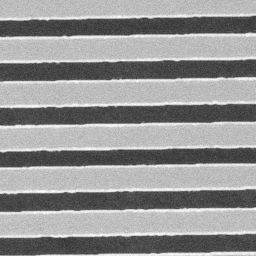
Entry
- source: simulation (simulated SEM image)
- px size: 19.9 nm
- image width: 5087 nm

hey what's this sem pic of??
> lines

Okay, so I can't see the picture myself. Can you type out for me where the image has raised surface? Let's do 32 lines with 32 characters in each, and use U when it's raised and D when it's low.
UUUUUUUUUUUUUUUUUUUUUUUUUUUUUUUU
UUUUUUUUUUUUUUUUUUUUUUUUUUUUUUUU
DDDDDDDDDDDDDDDDDDDDDDDDDDDDDDDD
DDDDDDDDDDDDDDDDDDDDDDDDDDDDDDDD
DDDDDDDDDDDDDDDDUUUUUUUUUUUUUUUU
UUUUUUUUUUUUUUUUUUUUUUUUUUUUUUUU
UUUUUUUUUUUUUUUUUUUUUUUUUUUUUUUU
UUUUUUUUUUUUUUUUUUUUDUUDDDDDDDDD
DDDDDDDDDDDDDDDDDDDDDDDDDDDDDDDD
DDDDDDDDDDDDDDDDDDDDDDDDDDDDDDDD
UUUUUUUUUUUUUUUUUUUUUUUUUUUUUUUU
UUUUUUUUUUUUUUUUUUUUUUUUUUUUUUUU
UUUUUUUUUUUUUUUUUUUUUUUUUUUUUUUU
DDDDDDDDDDDDDDDDDDDDDDDDDDDDDDDD
DDDDDDDDDDDDDDDDDDDDDDDDDDDDDDDD
DDDDDDDDDDDDDDDDDDUUUUUUUUUUUUUU
UUUUUUUUUUUUUUUUUUUUUUUUUUUUUUUU
UUUUUUUUUUUUUUUUUUUUUUUUUUUUUUUU
UUUUUUUUUUUUUUUUUUUUUDDDDDDDDDDD
DDDDDDDDDDDDDDDDDDDDDDDDDDDDDDDD
DDDDDDDDDDDDDDDDDDDDDDDDDDDDDDDD
UUUUUUUUUUUUUUUUUUUUUUUUUUUUUUUU
UUUUUUUUUUUUUUUUUUUUUUUUUUUUUUUU
UUUUUUUUUUUUUUUUUUUUUUUUUUUUUUUU
DDDDDDDDDDDDDDDDDDDDDDDDDDDDDDDD
DDDDDDDDDDDDDDDDDDDDDDDDDDDDDDDD
DDUUUUUUUUUUUUUUUUUUUUUUUUUUUUUU
UUUUUUUUUUUUUUUUUUUUUUUUUUUUUUUU
UUUUUUUUUUUUUUUUUUUUUUUUUUUUUUUU
UUUUUUUUUUUUUUDDDDDDDDDDDDDDDDDD
DDDDDDDDDDDDDDDDDDDDDDDDDDDDDDDD
DDDDDDDDDDDDDDDDDDDDDDDDDDDDDDDD